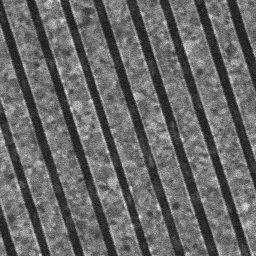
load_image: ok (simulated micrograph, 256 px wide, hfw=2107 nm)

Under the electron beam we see parallel lines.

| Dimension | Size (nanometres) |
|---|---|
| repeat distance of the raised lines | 262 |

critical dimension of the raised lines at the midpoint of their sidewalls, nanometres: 179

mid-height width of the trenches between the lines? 86.2 nm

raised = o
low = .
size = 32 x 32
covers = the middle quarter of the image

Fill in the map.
oooo...ooooo...ooooo...oooooo...
oooo...oooooo..oooooo...ooooo...
ooooo..oooooo...ooooo...oooooo..
ooooo...ooooo...ooooo...oooooo..
ooooo...oooooo..oooooo...ooooo..
oooooo..oooooo...ooooo...oooooo.
oooooo...ooooo...oooooo..oooooo.
.ooooo...oooooo..oooooo...ooooo.
.oooooo..oooooo...ooooo...oooooo
.oooooo...ooooo...oooooo...ooooo
..ooooo...oooooo..oooooo...ooooo
..oooooo..oooooo...ooooo...ooooo
..oooooo...ooooo...oooooo...oooo
...ooooo...oooooo..oooooo...oooo
...oooooo..oooooo...ooooo...oooo
...oooooo..oooooo...ooooo...oooo
o...ooooo...oooooo..oooooo...ooo
o...oooooo..oooooo...ooooo...ooo
o...oooooo..oooooo...oooooo..ooo
oo..oooooo...ooooo...oooooo...oo
oo...oooooo..oooooo...ooooo...oo
oo...oooooo..oooooo...oooooo..oo
ooo..oooooo...ooooo...oooooo...o
ooo...ooooo...oooooo..oooooo...o
ooo...oooooo..oooooo...oooooo..o
oooo..oooooo...ooooo...oooooo...
oooo...ooooo...oooooo..oooooo...
oooo...oooooo..oooooo...ooooo...
ooooo..oooooo...ooooo...oooooo..
ooooo...ooooo...oooooo..oooooo..
ooooo...oooooo..oooooo...ooooo..
oooooo..oooooo...ooooo...oooooo.